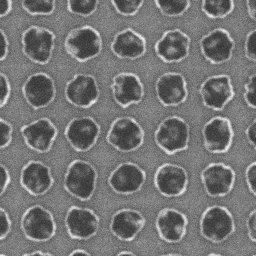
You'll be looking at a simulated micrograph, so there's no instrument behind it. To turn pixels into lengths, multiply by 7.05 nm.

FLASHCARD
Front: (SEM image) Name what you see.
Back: a regular array of raised bodies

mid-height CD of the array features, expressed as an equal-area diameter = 0.227 um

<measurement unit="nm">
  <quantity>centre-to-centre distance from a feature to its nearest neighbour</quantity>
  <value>308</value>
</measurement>